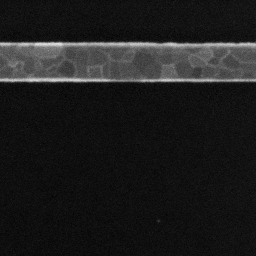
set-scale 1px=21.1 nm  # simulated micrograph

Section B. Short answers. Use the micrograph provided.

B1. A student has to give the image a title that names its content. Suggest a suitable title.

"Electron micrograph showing lines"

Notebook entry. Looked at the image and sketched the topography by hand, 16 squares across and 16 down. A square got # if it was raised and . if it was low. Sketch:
................
................
................
################
################
................
................
................
................
................
................
................
................
................
................
................